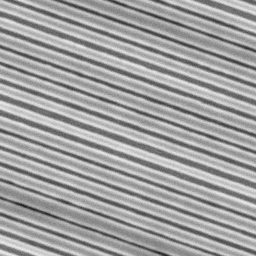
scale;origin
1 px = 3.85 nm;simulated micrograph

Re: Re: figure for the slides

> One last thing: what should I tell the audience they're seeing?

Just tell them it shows parallel lines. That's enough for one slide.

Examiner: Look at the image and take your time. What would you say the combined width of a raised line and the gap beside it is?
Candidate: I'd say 60.8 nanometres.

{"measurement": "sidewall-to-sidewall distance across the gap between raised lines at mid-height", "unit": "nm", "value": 18.6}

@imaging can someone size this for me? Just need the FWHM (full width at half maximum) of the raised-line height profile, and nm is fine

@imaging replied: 41.4